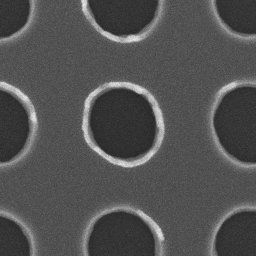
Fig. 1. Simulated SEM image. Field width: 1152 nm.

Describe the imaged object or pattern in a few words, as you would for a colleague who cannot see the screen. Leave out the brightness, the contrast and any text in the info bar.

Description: holes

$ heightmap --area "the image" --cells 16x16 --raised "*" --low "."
..****....****..
..****...*****..
****************
****************
****************
*******.*******.
.*****...*****..
..****....***...
..****....****..
.******..*****..
****************
****************
****************
******...*****..
..****....****..
..***.....***...